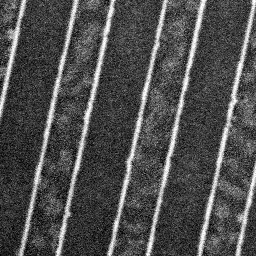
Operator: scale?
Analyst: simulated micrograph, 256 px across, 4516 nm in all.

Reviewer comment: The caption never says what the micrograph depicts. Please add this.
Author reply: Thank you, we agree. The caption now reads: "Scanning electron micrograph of one or a few lines or trenches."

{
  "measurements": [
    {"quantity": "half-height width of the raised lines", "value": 900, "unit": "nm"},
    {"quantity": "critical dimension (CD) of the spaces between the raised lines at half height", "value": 640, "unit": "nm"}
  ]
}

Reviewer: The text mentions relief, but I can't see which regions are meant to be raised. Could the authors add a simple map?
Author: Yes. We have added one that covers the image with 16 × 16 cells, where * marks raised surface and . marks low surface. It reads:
.****..***...***
.***...***..****
.***...***..***.
.***..****..***.
.***..***...***.
****..***...***.
***...***..****.
***..****..***..
***..****..***..
***..***...***..
**...***..****..
**...***..***...
**..****..***...
**..***...***..*
**..***...***..*
*...***..****..*